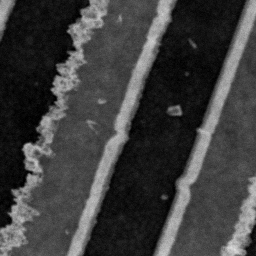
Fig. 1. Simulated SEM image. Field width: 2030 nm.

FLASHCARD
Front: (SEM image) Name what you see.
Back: one or a few lines or trenches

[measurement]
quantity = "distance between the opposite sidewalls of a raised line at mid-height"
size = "515 nanometers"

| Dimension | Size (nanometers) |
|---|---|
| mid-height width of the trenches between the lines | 674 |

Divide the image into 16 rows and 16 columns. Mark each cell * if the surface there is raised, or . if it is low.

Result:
......****......
.....*****.....*
.....****......*
.....****......*
....*****.....**
....****......**
....****......**
...*****.....***
...****......***
..*****......***
..****......****
..****......****
.*****.....*****
.****......****.
.****......****.
*****.....*****.